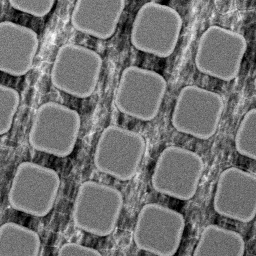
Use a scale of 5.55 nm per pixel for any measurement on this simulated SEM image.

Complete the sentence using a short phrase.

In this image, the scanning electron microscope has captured a regular array of raised bodies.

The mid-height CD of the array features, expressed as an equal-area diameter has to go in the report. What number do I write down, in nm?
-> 275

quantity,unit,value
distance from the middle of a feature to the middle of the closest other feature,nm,347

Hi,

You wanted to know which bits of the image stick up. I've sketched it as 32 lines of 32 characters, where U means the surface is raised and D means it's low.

DUUUUUDDDDUUUUUDDDDDDDDDDDDDDDDD
DDDUUUDDDUUUUUUDDUUUUUDDDDDDDDDD
DDDDDDDDDUUUUUUDDUUUUUUDDDDDDDDD
UUUDDDDDDDUUUUDDDUUUUUDDDDUDDDDD
UUUUDDDDDDDDUUDDDUUUUUDDDUUUUUDD
UUUUUDDDDDDDDDDDDUUUUUDDDUUUUUUD
UUUUDDDUUUUUDDDDDDDUUDDDDUUUUUDD
UUUUDDDUUUUUDDDDDDDDDDDDDUUUUUDD
UUUUDDDUUUUUDDDDUDDDDDDDDUUUUUDD
DDDDDDDUUUUUDDDUUUUUDDDDDDDUUDDD
DDDDDDDUUUUUDDDUUUUUUDDDDDDDDDDD
UUDDDDDDUUUDDDDUUUUUUDDUUUDDDDDD
UUDDDDDDDDDDDDDUUUUUDDUUUUUUDDDD
UUDDDUUUDDDDDDDUUUUUDDUUUUUUDDDD
UUDDDUUUUUDDDDDDDUUDDDUUUUUDDDDU
UDDDUUUUUUDDDDDDDDDDDDUUUUUDDDUU
UDDDUUUUUUDDDUUUUDDDDDDUUUUDDDUU
DDDDUUUUUDDDDUUUUUDDDDDDDDDDDDUU
DDDDDUUUUDDDUUUUUUDDDUDDDDDDDDUU
DDDDDDDDDDDDUUUUUUDDUUUUUDDDDDDU
DDDUDDDDDDDDUUUUUDDDUUUUUDDDDDDD
DDUUUUUDDDDDDUUUUDDUUUUUUDDDUUDD
DDUUUUUDDDDDDDDDDDDUUUUUUDDUUUUU
DUUUUUUDDDUUUUDDDDDUUUUUDDDUUUUU
DUUUUUUDDDUUUUUDDDDDDDUUDDDUUUUU
DUUUUUUDDUUUUUUDDDDDDDDDDDDUUUUU
DDDUUUDDDUUUUUUDDDUUUUDDDDDUUUUU
DDDDDDDDDUUUUUDDDUUUUUUDDDDDDDUD
UUUDDDDDDDUUUUDDDUUUUUUDDDUUDDDD
UUUUUDDDDDDDDDDDDUUUUUUDDUUUUUDD
UUUUUDDDDDDDDDDDDUUUUUDDDUUUUUDD
UUUUUDDUUUUUDDDDDDDUUUDDUUUUUUDD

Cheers